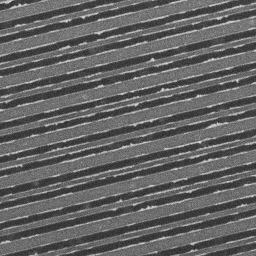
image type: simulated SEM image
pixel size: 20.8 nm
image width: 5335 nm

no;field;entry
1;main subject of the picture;parallel lines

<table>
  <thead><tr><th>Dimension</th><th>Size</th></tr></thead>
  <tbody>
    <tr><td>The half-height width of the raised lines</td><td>180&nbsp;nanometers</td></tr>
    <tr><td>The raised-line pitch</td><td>0.337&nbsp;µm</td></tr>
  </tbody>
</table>